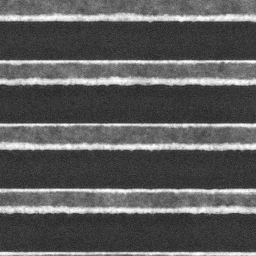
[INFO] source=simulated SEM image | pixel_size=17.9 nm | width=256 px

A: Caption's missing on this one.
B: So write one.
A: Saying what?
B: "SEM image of lines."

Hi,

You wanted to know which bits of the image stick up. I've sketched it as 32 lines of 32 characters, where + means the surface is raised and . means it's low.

++++++++++++++++++++++++++++++++
++++++++++++++++++++++++++++++++
..................+...+.++.....+
................................
................................
................................
................................
................................
++++++++++++++++++++++++++++++++
++++++++++++++++++++++++++++++++
................................
................................
................................
................................
................................
................................
++++++++++++++++++++++++++++++++
++++++++++++++++++++++++++++++++
++++++++++++++++++++++++++++++++
................................
................................
................................
................................
................................
++++++++++++++++++++++++++++++++
++++++++++++++++++++++++++++++++
.+.+.+..++++++++++++.++.+++++.++
................................
................................
................................
................................
................................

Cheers